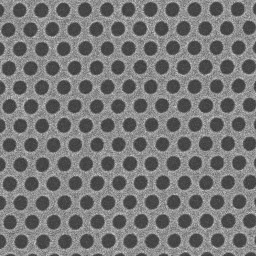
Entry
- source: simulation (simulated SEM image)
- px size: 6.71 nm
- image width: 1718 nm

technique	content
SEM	a regular array of holes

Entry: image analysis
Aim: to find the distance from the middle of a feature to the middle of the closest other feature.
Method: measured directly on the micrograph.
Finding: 145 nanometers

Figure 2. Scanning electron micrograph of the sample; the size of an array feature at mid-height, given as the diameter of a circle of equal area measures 95.2 nm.